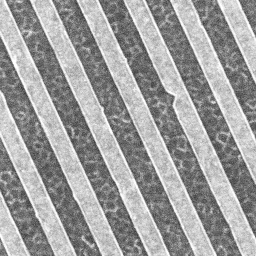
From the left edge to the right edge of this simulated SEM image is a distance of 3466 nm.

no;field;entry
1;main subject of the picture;parallel lines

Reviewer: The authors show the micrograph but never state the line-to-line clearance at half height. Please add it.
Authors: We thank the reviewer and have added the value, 0.329 microns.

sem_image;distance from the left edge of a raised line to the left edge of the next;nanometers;573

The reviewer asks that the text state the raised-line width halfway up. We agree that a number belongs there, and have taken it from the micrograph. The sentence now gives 236 nm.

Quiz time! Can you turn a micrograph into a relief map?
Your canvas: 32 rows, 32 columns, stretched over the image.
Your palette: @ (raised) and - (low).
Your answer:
@---@@@---@@----@@----@@---@@@--
@----@@---@@@---@@@---@@----@@--
@@---@@@---@@----@@----@@---@@@-
@@----@@---@@@---@@@---@@----@@-
@@@---@@----@@----@@---@@@---@@@
-@@---@@@---@@@---@@@---@@----@@
-@@@---@@----@@----@@---@@@---@@
--@@---@@@---@@@---@@----@@----@
--@@----@@----@@---@@@---@@@---@
--@@@---@@@---@@@---@@----@@----
---@@----@@----@@---@@@---@@@---
---@@@---@@@---@@----@@----@@---
@---@@----@@----@@----@@---@@@--
@---@@@---@@@---@@----@@----@@--
@----@@----@@---@@@---@@@---@@--
@@---@@@---@@----@@----@@----@@-
@@----@@----@@---@@@---@@@---@@-
@@@---@@@---@@----@@----@@---@@@
-@@----@@---@@@---@@@---@@@---@@
-@@@---@@@---@@----@@----@@---@@
--@@----@@---@@@---@@@---@@@---@
--@@@---@@----@@----@@---@@@---@
---@@---@@@---@@@---@@@---@@----
---@@@---@@----@@----@@---@@@---
----@@---@@@----@@---@@----@@---
@---@@----@@----@@----@@---@@@--
@---@@@---@@@---@@@---@@----@@--
@----@@----@@----@@---@@@---@@@-
@@----@@---@@@---@@@---@@----@@-
@@@---@@----@@----@@---@@@---@@@
-@@---@@@---@@@---@@----@@----@@
-@@----@@----@@---@@@---@@@---@@